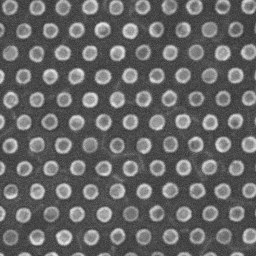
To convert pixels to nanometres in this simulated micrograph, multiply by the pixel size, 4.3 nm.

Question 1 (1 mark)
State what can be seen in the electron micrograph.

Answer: a regular array of raised bodies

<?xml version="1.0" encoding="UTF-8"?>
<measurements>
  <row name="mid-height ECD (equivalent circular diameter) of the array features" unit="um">0.0621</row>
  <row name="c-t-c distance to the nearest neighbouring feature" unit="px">25.9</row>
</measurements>